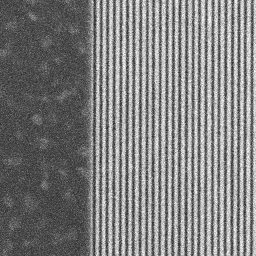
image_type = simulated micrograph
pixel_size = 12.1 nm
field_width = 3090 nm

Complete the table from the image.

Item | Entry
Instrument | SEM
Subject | parallel lines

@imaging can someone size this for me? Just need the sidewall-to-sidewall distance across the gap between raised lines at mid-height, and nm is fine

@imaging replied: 45.2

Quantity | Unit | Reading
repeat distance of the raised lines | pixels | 6.56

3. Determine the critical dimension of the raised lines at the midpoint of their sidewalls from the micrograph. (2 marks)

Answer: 36.2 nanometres